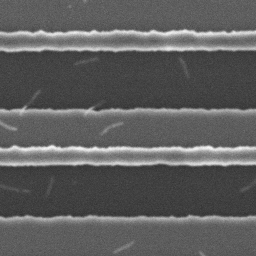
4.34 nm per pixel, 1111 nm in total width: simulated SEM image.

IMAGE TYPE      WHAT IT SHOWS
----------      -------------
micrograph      lines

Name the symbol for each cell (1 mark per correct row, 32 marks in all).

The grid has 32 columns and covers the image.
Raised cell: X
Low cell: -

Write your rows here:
XXXXXXXXXXXXXXXXXXXXXXXXXXXXXXXX
XXXXXXXXXXXXXXXXXXXXXXXXXXXXXXXX
XXXXXXXXXXXXXXXXXXXXXXXXXXXXXXXX
XXXXXXXXXXXXXXXXXXXXXXXXXXXXXXXX
XXXXXXXXXXXXXXXXXXXXXXXXXXXXXXXX
XXXXXXXXXXXXXXXXXXXXXXXXXXXXXXXX
--------------------------------
--------------------------------
--------------------------------
--------------------------------
--------------------------------
--------------------------------
--------------------------------
--------------------------------
XXXXXXXXXXXXXXXXXXXXXXXXXXXXXXXX
XXXXXXXXXXXXXXXXXXXXXXXXXXXXXXXX
XXXXXXXXXXXXXXXXXXXXXXXXXXXXXXXX
XXXXXXXXXXXXXXXXXXXXXXXXXXXXXXXX
XXXXXXXXXXXXXXXXXXXXXXXXXXXXXXXX
XXXXXXXXXXXXXXXXXXXXXXXXXXXXXXXX
XXXXXXXXXXXXXXXXXXX--XXXXXXXXXXX
--------------------------------
--------------------------------
--------------------------------
--------------------------------
--------------------------------
--------------------------------
XXXXXXXXXXXXXXXXXXXXXXXXXXXXXXXX
XXXXXXXXXXXXXXXXXXXXXXXXXXXXXXXX
XXXXXXXXXXXXXXXXXXXXXXXXXXXXXXXX
XXXXXXXXXXXXXXXXXXXXXXXXXXXXXXXX
XXXXXXXXXXXXXXXXXXXXXXXXXXXXXXXX